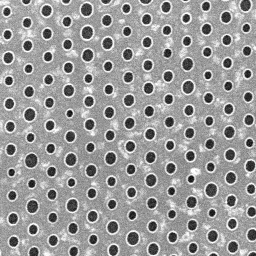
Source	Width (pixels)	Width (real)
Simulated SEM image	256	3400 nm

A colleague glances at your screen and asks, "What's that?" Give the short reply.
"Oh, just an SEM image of a regular array of holes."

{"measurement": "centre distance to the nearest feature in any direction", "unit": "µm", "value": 0.302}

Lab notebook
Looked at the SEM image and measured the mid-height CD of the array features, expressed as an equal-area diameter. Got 136 nanometres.